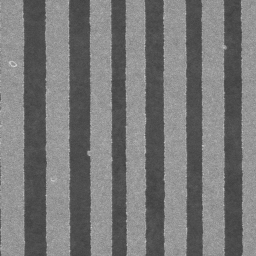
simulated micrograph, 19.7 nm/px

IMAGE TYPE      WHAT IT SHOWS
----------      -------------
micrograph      parallel lines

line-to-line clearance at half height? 0.367 micrometres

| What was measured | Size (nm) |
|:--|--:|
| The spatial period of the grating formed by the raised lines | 779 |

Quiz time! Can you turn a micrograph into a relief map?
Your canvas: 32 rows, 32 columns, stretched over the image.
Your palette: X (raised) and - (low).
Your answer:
XXX---XXX--XXX--XX--XXX--XXX--XX
XXX---XXX--XXX--XX---XX--XXX--XX
XXX---XXX--XXX--XX---XX--XXX--XX
XXX---XXX--XXX--XX---XX--XXX--XX
XXX---XXX--XXX--XX---XX--XXX--XX
XXX---XXX--XXX--XX---XX--XXX--XX
XXX---XXX--XXX--XX---XX--XXX--XX
XXX---XXX--XXX--XX---XX--XXX--XX
XXX---XXX--XXX--XX---XX--XXX--XX
XXX---XXX--XXX--XX---XX--XXX--XX
XXX---XXX--XXX--XX---XX--XXX--XX
XXX---XXX--XXX--XX---XX--XXX--XX
XXX---XXX--XXX--XX---XX--XXX--XX
XXX---XXX--XXX--XX---XX--XXX--XX
XXX---XXX--XXX--XX---XX--XXX--XX
XXX---XXX--XXX--XX---XX--XXX--XX
XXX---XXX--XXX--XX---XX--XXX--XX
XXX---XXX--XXX--XX---XX--XXX--XX
XXX---XXX--XXX--XX---XX--XXX--XX
XXX---XXX--XXX--XX---XX--XXX--XX
XXX---XXX--XXX--XX---XX--XXX--XX
XXX---XXX--XXX--XX---XX--XXX--XX
XXX---XXX--XXX--XX---XX--XXX--XX
XXX---XXX--XXX--XX---XX--XXX--XX
XXX---XXX--XXX--XX---XX--XXX--XX
XXX---XXX--XXX--XX---XX--XXX--XX
XXX---XXX--XXX--XX---XX--XXX--XX
XXX---XXX--XXX--XX---XX--XXX--XX
XXX---XXX--XXX--XX---XX--XXX--XX
XXX---XXX--XXX--XX---XX--XXX--XX
XXX---XXX--XXX--XX---XX--XXX--XX
XXX---XXX--XXX--XX---XX--XXX--XX